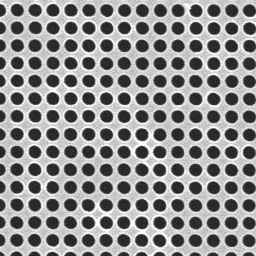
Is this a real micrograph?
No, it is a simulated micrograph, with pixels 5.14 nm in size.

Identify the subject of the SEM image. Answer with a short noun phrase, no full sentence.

a regular array of holes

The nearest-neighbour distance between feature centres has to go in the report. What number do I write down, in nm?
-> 89.2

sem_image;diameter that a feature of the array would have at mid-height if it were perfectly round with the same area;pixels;13.2